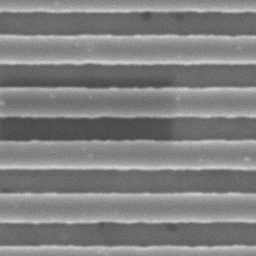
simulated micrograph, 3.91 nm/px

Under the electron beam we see lines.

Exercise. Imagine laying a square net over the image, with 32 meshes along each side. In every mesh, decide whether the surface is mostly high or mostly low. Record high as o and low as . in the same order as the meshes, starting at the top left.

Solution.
oooooooooooooooooooooooooooooooo
................................
................................
................................
ooo.o.o...oooo...oooooooooo...o.
oooooooooooooooooooooooooooooooo
oooooooooooooooooooooooooooooooo
oooooooooooooooooooooooooooooooo
................................
................................
................................
oooooooooooooooooooooooooooooooo
oooooooooooooooooooooooooooooooo
oooooooooooooooooooooooooooooooo
o.ooooooooooo.oooooooo...oo.oo.o
................................
................................
................................
oooooooooooooooooooooooooooooooo
oooooooooooooooooooooooooooooooo
oooooooooooooooooooooooooooooooo
................................
................................
................................
oooooooooooooooooooooooooooooooo
oooooooooooooooooooooooooooooooo
oooooooooooooooooooooooooooooooo
oooooooooooooooooooooooooooooooo
................................
................................
................................
oooooooooooooooooooooooooooooooo